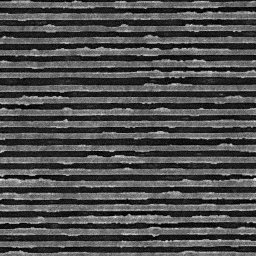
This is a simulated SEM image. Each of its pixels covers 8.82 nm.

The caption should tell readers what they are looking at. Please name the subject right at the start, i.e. parallel lines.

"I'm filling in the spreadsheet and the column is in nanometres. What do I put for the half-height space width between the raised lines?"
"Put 54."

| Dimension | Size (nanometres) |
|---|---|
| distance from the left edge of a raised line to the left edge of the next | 105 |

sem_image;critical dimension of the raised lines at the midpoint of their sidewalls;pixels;5.37